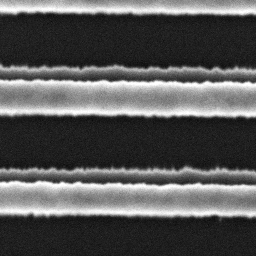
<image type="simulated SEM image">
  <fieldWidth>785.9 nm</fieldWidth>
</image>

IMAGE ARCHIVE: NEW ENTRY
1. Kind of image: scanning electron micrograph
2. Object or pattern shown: lines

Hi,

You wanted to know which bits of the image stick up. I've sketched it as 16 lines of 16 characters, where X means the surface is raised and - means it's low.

XXXXXXXXXXXXXXXX
----------------
----------------
----------------
XXXXXXXXXXXXXXXX
XXXXXXXXXXXXXXXX
XXXXXXXXXXXXXXXX
----------------
----------------
----------------
----------------
XXXXXXXXXXXXXXXX
XXXXXXXXXXXXXXXX
----------------
----------------
----------------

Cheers